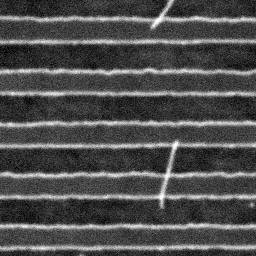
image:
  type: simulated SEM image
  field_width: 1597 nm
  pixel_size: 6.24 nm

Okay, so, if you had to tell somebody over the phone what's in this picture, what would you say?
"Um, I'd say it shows lines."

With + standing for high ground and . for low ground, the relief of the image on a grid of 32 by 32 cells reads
................................
................................
++++++++++++++++++++++++++++++++
++++++++++++++++++++++++++++++++
++++++++++++++++++++++++++++++++
................................
................................
................................
................................
++++++++++++++++++++++++++++++++
++++++++++++++++++++++++++++++++
++++++++++++++++++++++++++++++++
................................
................................
................................
++.+++++++++++++++++++++++++++++
++++++++++++++++++++++++++++++++
++++++++++++++++++++++++++++++++
................................
................................
................................
................................
++++++++++++++++++++++++++++++++
++++++++++++++++++++++++++++++++
++++++++++++++++++++++++++++++++
................................
................................
................................
++++++++++++++++++++++++++++++++
++++++++++++++++++++++++++++++++
++++++++++++++++++++++++++++++++
................................